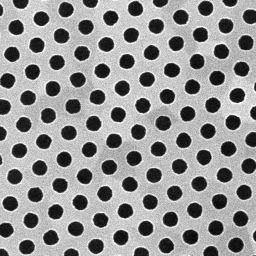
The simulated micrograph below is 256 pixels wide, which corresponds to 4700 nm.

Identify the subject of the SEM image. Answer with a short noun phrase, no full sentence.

a regular array of holes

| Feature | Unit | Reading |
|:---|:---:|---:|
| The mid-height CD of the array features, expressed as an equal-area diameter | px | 15.8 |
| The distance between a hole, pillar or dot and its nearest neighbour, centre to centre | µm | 0.479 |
